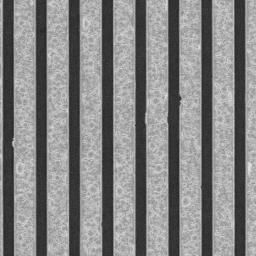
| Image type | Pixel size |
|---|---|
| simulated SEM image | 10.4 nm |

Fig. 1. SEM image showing parallel lines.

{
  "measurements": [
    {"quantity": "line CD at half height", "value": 225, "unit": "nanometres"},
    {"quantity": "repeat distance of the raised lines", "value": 344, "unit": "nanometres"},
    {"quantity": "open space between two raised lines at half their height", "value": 0.117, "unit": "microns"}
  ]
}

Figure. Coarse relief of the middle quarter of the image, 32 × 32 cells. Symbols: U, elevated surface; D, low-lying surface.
UDDDUUUUUDDDUUUUUUDDDUUUUUDDDUUU
UDDDUUUUUDDDUUUUUUDDDUUUUUDDDUUU
UDDDUUUUUDDDDUUUUUDDDUUUUUDDDUUU
UDDDUUUUUDDDDUUUUUDDDUUUUUDDDUUU
UDDDUUUUUDDDDUUUUUDDDUUUUUDDDUUU
UDDDUUUUUDDDDUUUUUDDDUUUUUDDDUUU
UDDDUUUUUDDDDUUUUUDDDUUUUUDDDUUU
UDDDUUUUUDDDDUUUUUDDDUUUUUDDDUUU
UDDDUUUUUDDDUUUUUUDDDUUUUUDDDUUU
UDDDUUUUUDDDUUUUUUDDDUUUUUDDDUUU
UDDDUUUUUDDDUUUUUUDDDUUUUUDDDUUU
UDDDUUUUUDDDUUUUUUDDDUUUUUDDDUUU
UDDDUUUUUDDDUUUUUUDDDUUUUUDDDUUU
UDDDUUUUUDDDUUUUUUDDDUUUUUDDDUUU
UDDDUUUUUDDDUUUUUUDDDUUUUUDDDUUU
UDDDUUUUUDDDUUUUUUDDDUUUUUDDDUUU
UDDDUUUUUDDDUUUUUUDDDUUUUUDDDUUU
UDDDUUUUUDDDUUUUUUDDDUUUUUDDDUUU
UDDDUUUUUDDDUUUUUUDDDUUUUUDDDUUU
UDDDUUUUUDDDUUUUUUDDDUUUUUDDDUUU
UDDDUUUUUDDDUUUUUUDDDUUUUUDDDUUU
UDDDUUUUUDDDUUUUUUDDDUUUUUDDDUUU
UDDDUUUUUDDDUUUUUUDDDUUUUUDDDUUU
UDDDUUUUUDDDUUUUUUDDDUUUUUDDDUUU
UDDDUUUUUDDDUUUUUUDDDUUUUUDDDUUU
UDDDUUUUUDDDUUUUUUDDDUUUUUDDDUUU
UDDDUUUUUDDDUUUUUUDDDUUUUUDDDUUU
UDDDUUUUUDDDUUUUUUDDDUUUUUDDDUUU
UDDDUUUUUDDDUUUUUUDDDUUUUUDDDUUU
UDDDUUUUUDDDUUUUUUDDDUUUUUDDDUUU
UDDDUUUUUDDDUUUUUUDDDUUUUUDDDUUU
UDDDUUUUUDDDUUUUUUDDDUUUUUDDDUUU